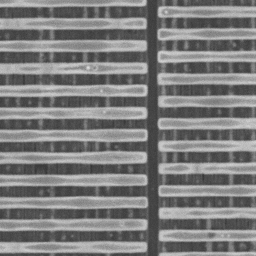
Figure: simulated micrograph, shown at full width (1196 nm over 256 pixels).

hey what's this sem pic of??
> wiring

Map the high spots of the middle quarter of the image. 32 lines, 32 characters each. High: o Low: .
ooooooooooooooooooooo...........
ooooooooooooooooooooo...........
................................
........................oooooooo
........................oooooooo
.......ooooo....oooo............
ooooooooooooooooooooo...........
ooooooooooooooooooooo...........
........................oooooooo
........................oooooooo
..........................oo....
oooooooooooooooooooo............
oooooooooooooooooooo............
.........ooooooooo..............
........................oooooooo
........................oooooooo
................................
ooooooooooooooooooooo...........
ooooooooooooooooooooo...........
.............................ooo
........................oooooooo
..........................oooooo
o..ooooooooooooooooo............
ooooooooooooooooooooo...........
oo.ooooooooooooooooo............
........................oooooooo
........................oooooooo
................................
ooooooooooooooooooooo...........
ooooooooooooooooooooo...........
........................oo......
........................oooooooo